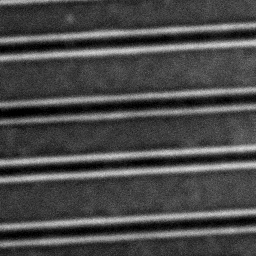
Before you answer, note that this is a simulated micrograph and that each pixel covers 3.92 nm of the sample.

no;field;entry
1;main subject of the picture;parallel lines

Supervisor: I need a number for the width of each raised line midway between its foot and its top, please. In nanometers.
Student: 75.8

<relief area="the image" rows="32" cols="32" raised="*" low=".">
................................
................................
................................
.........................*******
........************************
*******************************.
**************..................
................................
................................
................................
................................
.........................*******
........************************
*******************************.
**************..................
................................
................................
................................
..............................**
.............*******************
********************************
*****************.*.............
**..............................
................................
................................
................................
..............................**
.............*******************
********************************
*******************.............
**..............................
................................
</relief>